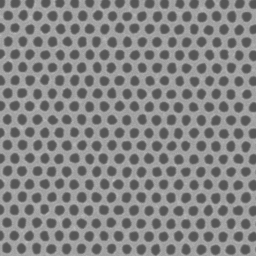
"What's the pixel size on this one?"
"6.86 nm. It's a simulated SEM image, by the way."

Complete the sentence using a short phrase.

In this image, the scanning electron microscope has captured a regular array of holes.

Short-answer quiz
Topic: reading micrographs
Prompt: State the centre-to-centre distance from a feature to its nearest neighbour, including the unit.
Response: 98.3 nm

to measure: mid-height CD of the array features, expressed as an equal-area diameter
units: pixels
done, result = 10.3